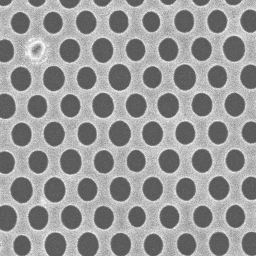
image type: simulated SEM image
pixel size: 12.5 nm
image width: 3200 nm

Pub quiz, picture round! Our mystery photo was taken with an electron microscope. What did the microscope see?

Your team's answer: a regular array of holes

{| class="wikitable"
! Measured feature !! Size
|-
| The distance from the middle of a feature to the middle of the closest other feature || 400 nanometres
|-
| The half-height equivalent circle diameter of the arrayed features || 0.274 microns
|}